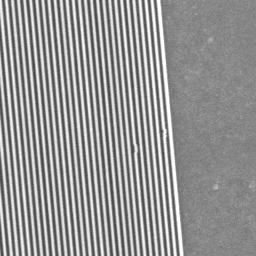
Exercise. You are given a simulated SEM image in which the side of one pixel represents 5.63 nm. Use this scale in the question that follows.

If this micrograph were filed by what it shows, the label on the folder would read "parallel lines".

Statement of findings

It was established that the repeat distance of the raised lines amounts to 6.04 px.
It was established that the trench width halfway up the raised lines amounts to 0.0217 microns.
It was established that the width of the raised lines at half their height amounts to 16.1 nm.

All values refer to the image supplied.